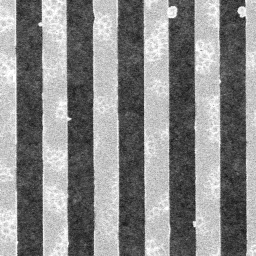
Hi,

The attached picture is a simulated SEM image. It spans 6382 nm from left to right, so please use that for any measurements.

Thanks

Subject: parallel lines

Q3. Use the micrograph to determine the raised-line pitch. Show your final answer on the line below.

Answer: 1260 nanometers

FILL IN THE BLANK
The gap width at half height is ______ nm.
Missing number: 667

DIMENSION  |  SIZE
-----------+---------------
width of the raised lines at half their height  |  592 nanometres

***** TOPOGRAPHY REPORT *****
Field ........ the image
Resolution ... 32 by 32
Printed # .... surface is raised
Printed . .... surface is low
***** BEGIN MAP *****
##...###....###...###...###....#
##...###....###...####..###...##
##...###....###...###...###....#
##...###....###...###...###....#
##...###....###...###...###....#
##...###....###...###...###....#
##...###....###...###....##....#
##...###....###...###...###....#
##...###....###...###...###....#
##...###....###...###...###....#
##...###....###...###...###....#
##...###....###...###...###....#
##...###....###...###...###....#
##...###....###...###...###....#
##...###....###...###...###....#
##...###....###...###...###....#
##...###....###...###...###....#
##...###....###...###...###....#
##...###....###...###...###....#
##...###....###...###...###....#
##...###....###...###....##....#
##...###....###...###....##....#
##...###....###...###....##....#
##...###....###...###....##....#
##...###....###...###....##....#
##...###....###...###....##....#
##...###....###...###....##....#
##...###....###...###...###....#
##....##....###...###....##....#
##....##....###...###....##....#
##....##....###...###....##....#
##....##....###...###....##....#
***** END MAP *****